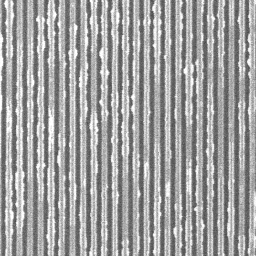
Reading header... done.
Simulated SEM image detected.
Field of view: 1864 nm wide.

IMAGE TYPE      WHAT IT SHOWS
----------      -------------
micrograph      parallel lines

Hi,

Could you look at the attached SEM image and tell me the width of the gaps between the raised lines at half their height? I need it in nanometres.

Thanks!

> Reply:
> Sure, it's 35.5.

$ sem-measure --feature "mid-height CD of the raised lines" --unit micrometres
0.0428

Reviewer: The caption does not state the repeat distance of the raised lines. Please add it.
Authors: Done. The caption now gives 76.9 nm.